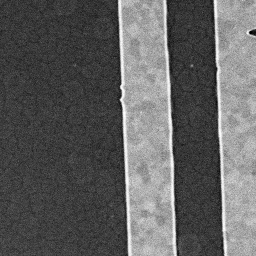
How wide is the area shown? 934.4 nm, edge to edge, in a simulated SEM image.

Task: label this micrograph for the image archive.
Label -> one or a few lines or trenches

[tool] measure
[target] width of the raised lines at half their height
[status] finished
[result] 166 nm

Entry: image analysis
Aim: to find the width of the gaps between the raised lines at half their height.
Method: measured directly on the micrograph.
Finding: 49.4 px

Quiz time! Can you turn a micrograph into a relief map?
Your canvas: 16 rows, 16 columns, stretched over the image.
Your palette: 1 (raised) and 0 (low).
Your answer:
0000000111000111
0000000111000111
0000000011000011
0000000011000011
0000000011100011
0000000011100011
0000000011100011
0000000011100011
0000000011100011
0000000011100011
0000000011100011
0000000011100011
0000000011100011
0000000011100011
0000000011100011
0000000011110011